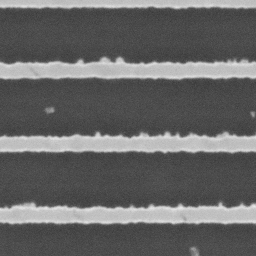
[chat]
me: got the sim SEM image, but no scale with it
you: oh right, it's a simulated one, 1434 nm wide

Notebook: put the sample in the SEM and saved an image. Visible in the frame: lines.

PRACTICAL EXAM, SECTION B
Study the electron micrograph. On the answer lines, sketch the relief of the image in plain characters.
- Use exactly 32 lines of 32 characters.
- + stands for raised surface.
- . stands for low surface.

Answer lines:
++++++++++++++++++++++++++++++++
................................
................................
................................
................................
................................
................................
................................
++++++++++++++++++++++++++++++++
++++++++++++++++++++++++++++++++
................................
................................
................................
................................
................................
................................
................................
++++++++++++++++++++++++++++++++
++++++++++++++++++++++++++++++++
................................
................................
................................
................................
................................
................................
................................
++++++++++++++++++++++++++++++++
++++++++++++++++++++++++++++++++
................................
................................
................................
................................